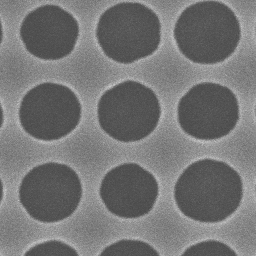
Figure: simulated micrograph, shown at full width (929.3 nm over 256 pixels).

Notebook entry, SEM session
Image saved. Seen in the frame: a regular array of holes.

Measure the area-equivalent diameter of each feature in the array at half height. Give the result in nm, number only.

223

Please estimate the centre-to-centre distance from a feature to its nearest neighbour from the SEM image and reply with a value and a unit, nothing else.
0.287 um